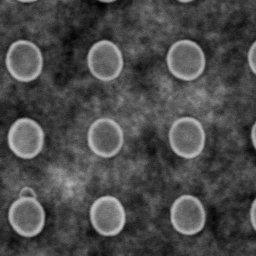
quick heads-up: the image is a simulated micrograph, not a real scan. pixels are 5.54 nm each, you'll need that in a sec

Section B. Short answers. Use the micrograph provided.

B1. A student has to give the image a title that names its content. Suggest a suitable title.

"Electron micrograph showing a regular array of raised bodies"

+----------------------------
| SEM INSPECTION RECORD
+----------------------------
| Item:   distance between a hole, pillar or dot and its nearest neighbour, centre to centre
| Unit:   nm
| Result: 430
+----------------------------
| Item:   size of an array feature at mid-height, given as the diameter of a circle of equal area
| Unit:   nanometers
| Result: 202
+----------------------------